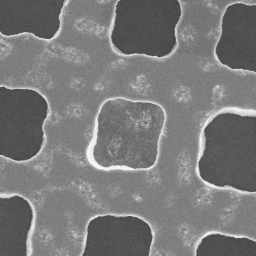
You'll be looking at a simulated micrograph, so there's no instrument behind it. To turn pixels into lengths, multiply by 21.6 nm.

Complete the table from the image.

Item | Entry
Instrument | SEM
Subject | holes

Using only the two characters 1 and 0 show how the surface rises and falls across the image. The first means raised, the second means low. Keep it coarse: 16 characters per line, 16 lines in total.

0000111000011100
0000111000011100
1111111000011100
1111111111111100
1111111111111111
1111111111111111
0001111000111111
0001110000111000
0001110000111000
0011110000111000
1111111101110000
1111111111111000
0011111111111111
0011110011111111
0011100001111111
0011100001110000